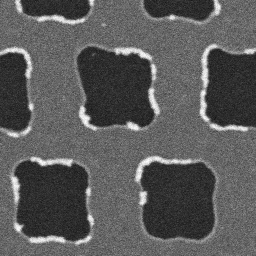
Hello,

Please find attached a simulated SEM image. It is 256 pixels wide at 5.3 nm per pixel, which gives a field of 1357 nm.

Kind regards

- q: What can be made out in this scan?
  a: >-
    holes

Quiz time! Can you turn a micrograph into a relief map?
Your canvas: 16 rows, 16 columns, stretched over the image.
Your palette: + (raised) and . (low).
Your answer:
+.....+++....+++
++++++++++++++++
++++++++++++++++
.++++....++++...
..+++....++++...
..+++....++++...
..+++....++++...
..++++....+++...
++++++++++++++++
++++++++++++++++
+....++++....+++
+....++++....+++
+....++++....+++
+.....+++....+++
+.....+++....+++
++++++++++++++++